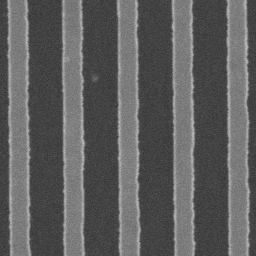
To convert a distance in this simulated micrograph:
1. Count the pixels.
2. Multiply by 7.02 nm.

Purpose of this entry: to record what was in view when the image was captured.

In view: lines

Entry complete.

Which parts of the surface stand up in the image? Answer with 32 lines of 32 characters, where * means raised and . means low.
.**.....**.....**.....**....***.
.**.....**.....**.....**....***.
.**.....**.....**.....**....***.
.**.....**.....**.....**.....**.
.**.....**.....**.....**....***.
.**.....**.....**.....**....***.
.***....**.....**.....**.....**.
.***....**.....**.....**....***.
.**.....**.....**.....**....***.
.**.....**.....**.....**.....**.
.**.....**.....**.....**.....**.
.**.....**.....**.....**.....**.
.**.....**.....**.....**.....**.
.**.....**.....**.....**.....**.
.***....**.....**.....**.....**.
.***....**.....**.....**.....**.
.***....**.....**.....**.....**.
.***....**.....**.....**.....**.
.***....**.....**.....**.....**.
.***....**.....**.....**.....**.
.***....**.....**.....**.....**.
.***....**.....**.....**.....**.
.***....**.....**.....**.....**.
.***....**.....**.....**.....**.
.***....**.....**.....**.....**.
.***....**.....**.....**.....**.
.***....**.....**.....**.....**.
.***....**.....**.....**.....**.
.***....**.....**.....**.....**.
.***....**.....**.....**.....**.
.***....**.....**.....**.....**.
.***....***....**.....**.....**.